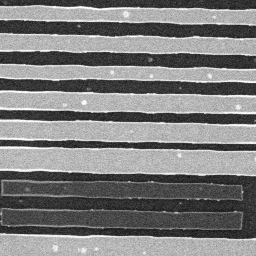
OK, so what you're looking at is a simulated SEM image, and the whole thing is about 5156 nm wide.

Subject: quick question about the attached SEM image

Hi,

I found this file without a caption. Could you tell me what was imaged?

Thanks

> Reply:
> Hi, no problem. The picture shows groups of lines, slits or small figures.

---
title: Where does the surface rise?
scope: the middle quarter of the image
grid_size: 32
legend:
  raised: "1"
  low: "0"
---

11110000000000000000000000000000
11111111111111111111111111111111
11111111111111111111111111111111
11111111111111111111111111111111
00000000000000000000000000000000
00000000000000000000000000000000
00000000000000000000000000000000
11111111100000000000000000000000
11111111111111111111111111111111
11111111111111111111111111111111
11111111111111111111111111111111
01111111111111111111111111111111
00000000000000000000000000000000
00000000000000000000000000000000
11111111100000000000000000000000
11111111111111111111111111111111
11111111111111111111111111111111
11111111111111111111111111111111
11111111111111111111111111111111
00000000000000000000000000000011
00000000000000000000000000000000
11111111111111111110010000000000
11111111111111111111111111111111
11111111111111111111111111111111
11111111111111111111111111111111
11111111111111111111111111111111
11111111111111111111111111111111
00000000000000000000000000000001
00000000000000000000000000000000
00000000111000000000000000000000
11111111111111111111111111111111
11111111111111111111111111111111